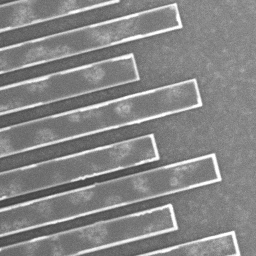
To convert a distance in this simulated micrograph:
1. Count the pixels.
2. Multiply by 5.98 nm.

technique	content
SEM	parallel lines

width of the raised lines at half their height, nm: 159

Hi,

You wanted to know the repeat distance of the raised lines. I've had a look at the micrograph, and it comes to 234 nm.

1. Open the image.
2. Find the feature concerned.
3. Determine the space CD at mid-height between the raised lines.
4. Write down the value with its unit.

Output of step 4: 79.7 nm